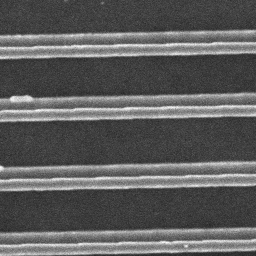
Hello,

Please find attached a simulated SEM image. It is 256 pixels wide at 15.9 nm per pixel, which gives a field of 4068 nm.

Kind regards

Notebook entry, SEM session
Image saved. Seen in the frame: lines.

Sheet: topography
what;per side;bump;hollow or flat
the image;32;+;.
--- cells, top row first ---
................................
................................
................................
................................
.........+++++++++++++++++++++++
++++++++++++++++++++++++++++++++
++++++++++++++++++++++++++++++++
................................
................................
................................
................................
................................
.+++++++++++++++++++++++++++++++
++++++++++++++++++++++++++++++++
+++++++++++++++++++++++++++.....
................................
................................
................................
................................
................................
.............................+++
++++++++++++++++++++++++++++++++
++++++++++++++++++++++++++++++++
++++++++++++++++................
................................
................................
................................
................................
................................
++++++++++++++++++++++++++++++++
++++++++++++++++++++++++++++++++
+++++++++++++++++++++++.........